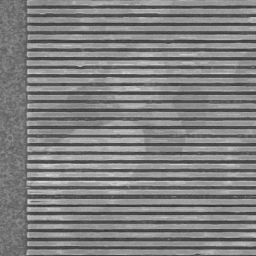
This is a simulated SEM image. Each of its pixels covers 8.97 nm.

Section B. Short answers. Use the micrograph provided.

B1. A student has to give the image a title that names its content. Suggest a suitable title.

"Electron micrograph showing parallel lines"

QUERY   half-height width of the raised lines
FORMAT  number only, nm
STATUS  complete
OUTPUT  40.4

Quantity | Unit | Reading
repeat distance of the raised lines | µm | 0.0771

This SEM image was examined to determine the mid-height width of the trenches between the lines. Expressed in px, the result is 3.62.